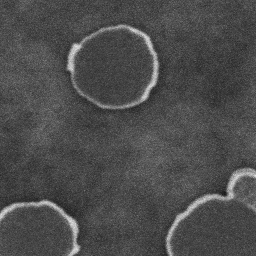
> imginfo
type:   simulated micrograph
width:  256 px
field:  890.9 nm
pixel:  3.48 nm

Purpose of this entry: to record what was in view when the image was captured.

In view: raised bodies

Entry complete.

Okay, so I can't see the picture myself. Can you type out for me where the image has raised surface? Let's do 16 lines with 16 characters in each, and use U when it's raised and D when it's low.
DDDDDDDDDDDDDDDD
DDDDDDDDDDDDDDDD
DDDDDUUUUDDDDDDD
DDDDUUUUUUDDDDDD
DDDDUUUUUUDDDDDD
DDDDDUUUUUDDDDDD
DDDDDDUUDDDDDDDD
DDDDDDDDDDDDDDDD
DDDDDDDDDDDDDDDD
DDDDDDDDDDDDDDDD
DDDDDDDDDDDDDDDD
DDDDDDDDDDDDDDUU
DDDDDDDDDDDDDUUU
UUUUDDDDDDDUUUUU
UUUUUDDDDDDUUUUU
UUUUUDDDDDUUUUUU